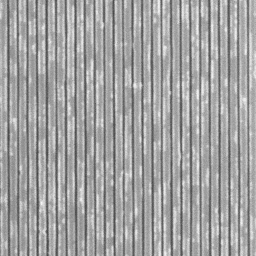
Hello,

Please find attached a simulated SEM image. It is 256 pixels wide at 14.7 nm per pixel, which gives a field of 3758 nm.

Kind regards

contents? parallel lines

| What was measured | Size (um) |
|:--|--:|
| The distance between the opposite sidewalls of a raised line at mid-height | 0.101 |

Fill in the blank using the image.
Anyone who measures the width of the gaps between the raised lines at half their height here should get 0.044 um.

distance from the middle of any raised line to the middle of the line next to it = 9.58 pixels